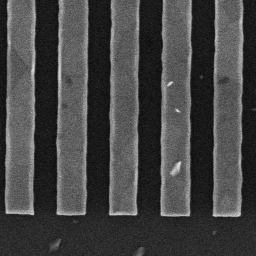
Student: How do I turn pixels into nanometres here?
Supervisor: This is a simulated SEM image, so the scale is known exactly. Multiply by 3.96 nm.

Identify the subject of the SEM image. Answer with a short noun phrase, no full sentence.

wiring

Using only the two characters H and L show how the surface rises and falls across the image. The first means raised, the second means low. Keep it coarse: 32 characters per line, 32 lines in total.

LHHHLLLHHHHLLLHHHLLLHHHHLLLHHHLL
LHHHLLLHHHHLLLHHHLLLHHHHLLLHHHLL
LHHHLLLHHHHLLLHHHLLLHHHHLLLHHHLL
LHHHLLLHHHHLLLHHHLLLHHHHLLLHHHLL
LHHHLLLHHHHLLLHHHLLLHHHHLLLHHHLL
LHHHLLLHHHHLLLHHHLLLHHHHLLLHHHLL
LHHHLLLHHHHLLLHHHLLLHHHHLLLHHHLL
LHHHLLLHHHHLLLHHHLLLHHHHLLLHHHLL
LHHHLLLHHHHLLLHHHLLLHHHHLLLHHHLL
LHHHLLLHHHHLLLHHHLLLHHHHLLLHHHLL
LHHHLLLHHHHLLLHHHLLLHHHHLLLHHHLL
LHHHLLLHHHHLLLHHHLLLHHHHLLLHHHLL
LHHHLLLHHHHLLLHHHLLLHHHHLLLHHHLL
LHHHLLLHHHHLLLHHHLLLHHHHLLLHHHLL
LHHHLLLHHHHLLLHHHLLLHHHHLLLHHHLL
LHHHLLLHHHHLLLHHHLLLHHHHLLLHHHLL
LHHHLLLHHHHLLLHHHLLLHHHHLLLHHHLL
LHHHLLLHHHHLLLHHHLLLHHHHLLLHHHLL
LHHHLLLHHHHLLLHHHLLLHHHHLLLHHHLL
LHHHLLLHHHHLLLHHHLLLHHHHLLLHHHLL
LHHHLLLHHHHLLLHHHLLLHHHHLLLHHHLL
LHHHLLLHHHHLLLHHHLLLHHHHLLLHHHLL
LHHHLLLHHHHLLLHHHLLLHHHHLLLHHHLL
LHHHLLLHHHHLLLHHHLLLHHHHLLLHHHLL
LHHHLLLHHHHLLLHHHLLLHHHHLLLHHHLL
LHHHLLLHHHHLLLHHHLLLHHHHLLLHHHLL
LHHHLLLHHHHLLLHHHLLLHHHHLLLHHHLL
LLLLLLLLLLLLLLLLLLLLLLLLLLLLLLLL
LLLLLLLLLLLLLLLLLLLLLLLLLLLLLLLL
LLLLLLLLLLLLLLLLLLLLLLLLLLLLLLLL
LLLLLLLLLLLLLLLLLLLLLLLLLLLLLLLL
LLLLLLLLLLLLLLLLLLLLLLLLLLLLLLLL